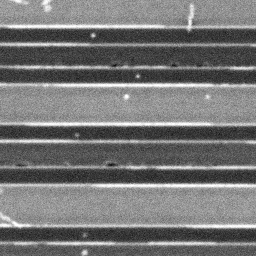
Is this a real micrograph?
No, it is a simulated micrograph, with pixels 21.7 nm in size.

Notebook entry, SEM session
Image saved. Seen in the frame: lines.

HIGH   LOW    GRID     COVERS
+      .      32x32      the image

................................
................................
................................
++++++++++++++++++++++++++++++++
++++++++++++++++++++++++++++++++
++++++++++++++++++++++++++++++++
................................
................................
++++++++++++++++++++++++++++++++
++++++++++++++++++++++++++++++++
++++++++++++++++++++++++++++++++
................................
................................
................................
................................
................................
++++++++++++++++++++++++++++++++
++++++++++++++++++++++++++++++++
................................
................................
................................
++++++++++++++++++++++++++++++++
++++++++++++++++++++++++++++++++
................................
................................
................................
................................
................................
++++++++++++++++++++++++++++++++
++++++++++++++++++++++++++++++++
................................
................................